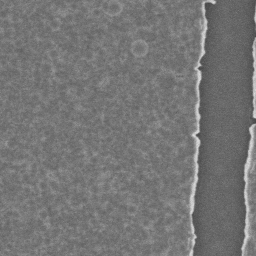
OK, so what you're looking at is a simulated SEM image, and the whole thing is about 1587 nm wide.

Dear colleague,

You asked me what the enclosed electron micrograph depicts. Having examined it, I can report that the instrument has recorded one or a few lines or trenches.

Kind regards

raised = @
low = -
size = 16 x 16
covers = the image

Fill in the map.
@@@@@@@@@@@@@---
@@@@@@@@@@@@@---
@@@@@@@@@@@@@---
@@@@@@@@@@@@@---
@@@@@@@@@@@@----
@@@@@@@@@@@@----
@@@@@@@@@@@@----
@@@@@@@@@@@@----
@@@@@@@@@@@@----
@@@@@@@@@@@@----
@@@@@@@@@@@@---@
@@@@@@@@@@@@---@
@@@@@@@@@@@@---@
@@@@@@@@@@@@---@
@@@@@@@@@@@@---@
@@@@@@@@@@@@---@